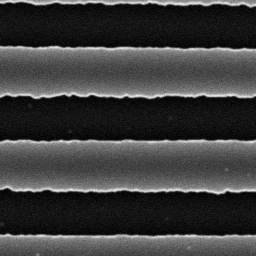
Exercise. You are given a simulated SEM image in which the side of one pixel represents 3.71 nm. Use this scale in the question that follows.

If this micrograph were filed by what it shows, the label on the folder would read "lines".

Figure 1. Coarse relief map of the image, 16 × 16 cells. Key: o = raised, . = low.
................
................
................
oooooooooooooooo
oooooooooooooooo
oooooooooooooooo
................
................
................
oooooooooooooooo
oooooooooooooooo
oooooooooooooooo
................
................
................
oooooooooooooooo